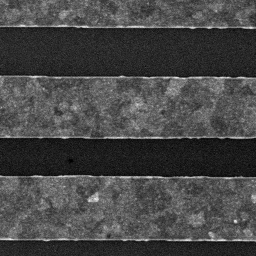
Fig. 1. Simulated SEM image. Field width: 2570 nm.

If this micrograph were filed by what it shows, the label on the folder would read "lines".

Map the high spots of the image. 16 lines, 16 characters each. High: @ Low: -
@@@@@@@@@@@@@@@@
@@@@@@@@@@@@@@@@
----------------
----------------
----------------
@@@@@@@@@@@@@@@@
@@@@@@@@@@@@@@@@
@@@@@@@@@@@@@@@@
@@@@@@@@@@@@@@@@
----------------
----------------
@@@@@@@@@@@@@@@@
@@@@@@@@@@@@@@@@
@@@@@@@@@@@@@@@@
@@@@@@@@@@@@@@@@
----------------